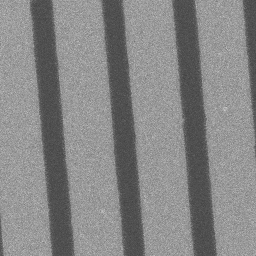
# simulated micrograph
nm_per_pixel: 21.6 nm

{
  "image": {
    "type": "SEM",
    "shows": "one or a few lines or trenches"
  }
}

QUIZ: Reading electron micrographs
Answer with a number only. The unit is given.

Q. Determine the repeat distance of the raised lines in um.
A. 1.53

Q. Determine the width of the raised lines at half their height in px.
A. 23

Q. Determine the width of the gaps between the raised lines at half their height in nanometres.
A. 1030